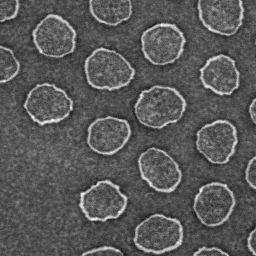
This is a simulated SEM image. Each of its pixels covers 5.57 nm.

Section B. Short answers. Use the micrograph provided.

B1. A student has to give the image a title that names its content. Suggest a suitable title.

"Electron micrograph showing a regular array of raised bodies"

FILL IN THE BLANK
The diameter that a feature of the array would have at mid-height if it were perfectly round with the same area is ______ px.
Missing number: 40.6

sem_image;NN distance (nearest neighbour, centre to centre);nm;349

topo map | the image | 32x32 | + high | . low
++.........+++++.........+++++..
++.........+++++.........+++++..
.....+++....++++.........+++++..
.....++++..........+++....++++..
....+++++.........+++++.........
.....++++.........+++++.........
+....++++...++....+++++.........
++.........+++++...+++....+++...
++.........+++++.........++++...
++.........++++++........+++++..
...........+++++..........++++..
....++++..........++++.....++...
...++++++........++++++.........
...++++++........++++++........+
....++++.........++++++........+
............++++..+++.....+++...
...........+++++.........++++...
...........+++++.........+++++..
............+++..........++++...
..................+++.....+++...
.................+++++.........+
..................++++.........+
..................++++.........+
...........++++....+++...+++....
..........+++++..........++++...
..........++++++........+++++...
...........++++.........+++++...
..................++++...+++....
.................++++++.........
.................++++++........+
.................+++++.........+
...........++++....+.....+++....